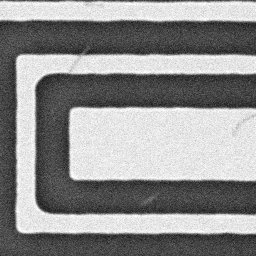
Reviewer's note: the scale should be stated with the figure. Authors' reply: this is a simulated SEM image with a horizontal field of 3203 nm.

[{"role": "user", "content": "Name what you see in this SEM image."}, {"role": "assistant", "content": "groups of lines, slits or small figures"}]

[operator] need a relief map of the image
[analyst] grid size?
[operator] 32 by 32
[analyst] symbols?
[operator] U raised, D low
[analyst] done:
UUUUUUUUUUUUUUUUUUUUUUUUUUUUUUUU
UUUUUUUUUUUUUUUUUUUUUUUUUUUUUUUU
DDDDDDDDDDDDDDDDDDDDDDDDDDDDDDDD
DDDDDDDDDDDDDDDDDDDDDDDDDDDDDDDD
DDDDDDDDDDDDDDDDDDDDDDDDDDDDDDDD
DDDDDDDDDDDDDDDDDDDDDDDDDDDDDDDD
DDDDDDDDDDDDDDDDDDDDDDDDDDDDDDDD
DDUUUUUUUUUUUUUUUUUUUUUUUUUUUUUU
DDUUUUUUUUUUUUUUUUUUUUUUUUUUUUUU
DDUUUDDDDDDDDDDDDDDDDDDDDDDDDDDD
DDUUDDDDDDDDDDDDDDDDDDDDDDDDDDDD
DDUUDDDDDDDDDDDDDDDDDDDDDDDDDDDD
DDUUDDDDDDDDDDDDDDDDDDDDDDDDDDDD
DDUUDDDDDDDDDDDDDDDDDDDDDDDDDDDD
DDUUDDDDDUUUUUUUUUUUUUUUUUUUUUUU
DDUUDDDDDUUUUUUUUUUUUUUUUUUUUUUU
DDUUDDDDDUUUUUUUUUUUUUUUUUUUUUUU
DDUUDDDDDUUUUUUUUUUUUUUUUUUUUUUU
DDUUDDDDDUUUUUUUUUUUUUUUUUUUUUUU
DDUUDDDDDUUUUUUUUUUUUUUUUUUUUUUU
DDUUDDDDDUUUUUUUUUUUUUUUUUUUUUUU
DDUUDDDDDUUUUUUUUUUUUUUUUUUUUUUU
DDUUDDDDDDDDDDDDDDDDDDDDDDDDDDDD
DDUUDDDDDDDDDDDDDDDDDDDDDDDDDDDD
DDUUDDDDDDDDDDDDDDDDDDDDDDDDDDDD
DDUUDDDDDDDDDDDDDDDDDDDDDDDDDDDD
DDUUUDDDDDDDDDDDDDDDDDDDDDDDDDDD
DDUUUUUUUUUUUUUUUUUUUUUUUUUUUUUU
DDUUUUUUUUUUUUUUUUUUUUUUUUUUUUUU
DDDDDDDDDDDDDDDDDDDDDDDDDDDDDDDD
DDDDDDDDDDDDDDDDDDDDDDDDDDDDDDDD
DDDDDDDDDDDDDDDDDDDDDDDDDDDDDDDD